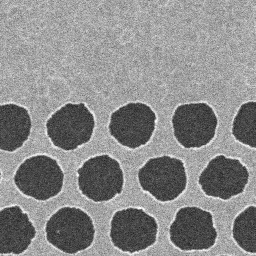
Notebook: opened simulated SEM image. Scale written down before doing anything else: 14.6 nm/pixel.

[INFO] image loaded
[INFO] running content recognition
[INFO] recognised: a regular array of holes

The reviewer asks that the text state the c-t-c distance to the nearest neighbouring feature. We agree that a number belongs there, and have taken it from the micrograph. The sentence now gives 0.874 microns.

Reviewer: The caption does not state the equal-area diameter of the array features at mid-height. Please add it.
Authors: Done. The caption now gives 694 nm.